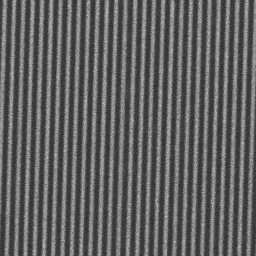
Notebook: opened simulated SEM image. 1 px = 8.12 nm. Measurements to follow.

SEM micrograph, parallel lines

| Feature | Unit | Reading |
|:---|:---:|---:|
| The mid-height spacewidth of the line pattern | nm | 37.6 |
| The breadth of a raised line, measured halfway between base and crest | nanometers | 36.5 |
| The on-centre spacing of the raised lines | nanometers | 75.5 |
